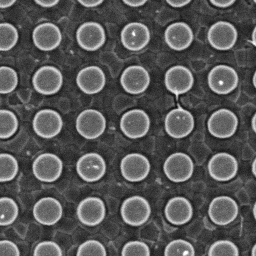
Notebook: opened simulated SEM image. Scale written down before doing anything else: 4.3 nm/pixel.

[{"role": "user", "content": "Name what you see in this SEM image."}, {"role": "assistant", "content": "a regular array of raised bodies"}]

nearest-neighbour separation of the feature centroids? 43.3 pixels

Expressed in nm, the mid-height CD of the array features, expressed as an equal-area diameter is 121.